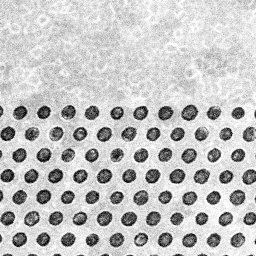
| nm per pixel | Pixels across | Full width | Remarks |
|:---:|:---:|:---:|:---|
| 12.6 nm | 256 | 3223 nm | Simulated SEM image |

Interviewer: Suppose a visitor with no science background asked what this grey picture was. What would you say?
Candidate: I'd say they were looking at a regular array of holes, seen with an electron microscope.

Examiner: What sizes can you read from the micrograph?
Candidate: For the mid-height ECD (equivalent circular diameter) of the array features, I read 192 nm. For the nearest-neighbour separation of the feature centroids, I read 301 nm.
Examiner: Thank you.